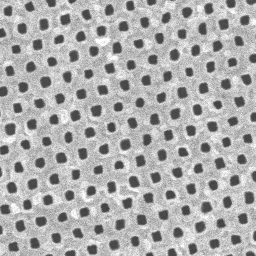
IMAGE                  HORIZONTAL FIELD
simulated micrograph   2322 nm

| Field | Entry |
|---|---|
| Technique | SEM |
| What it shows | a regular array of holes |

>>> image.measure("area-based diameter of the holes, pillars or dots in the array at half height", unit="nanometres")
93.2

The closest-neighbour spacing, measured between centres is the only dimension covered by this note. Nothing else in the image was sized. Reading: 194 nm